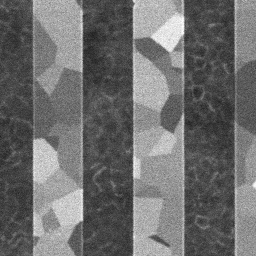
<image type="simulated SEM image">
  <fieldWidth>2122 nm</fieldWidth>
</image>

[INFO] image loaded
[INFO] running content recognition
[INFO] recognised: one or a few lines or trenches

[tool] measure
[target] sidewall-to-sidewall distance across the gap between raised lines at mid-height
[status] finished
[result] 431 nanometres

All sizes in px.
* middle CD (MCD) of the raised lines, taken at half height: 48.7